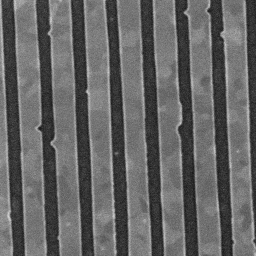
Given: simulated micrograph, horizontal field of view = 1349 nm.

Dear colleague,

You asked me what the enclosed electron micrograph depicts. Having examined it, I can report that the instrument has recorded parallel lines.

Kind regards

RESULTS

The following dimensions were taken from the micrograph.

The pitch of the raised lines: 183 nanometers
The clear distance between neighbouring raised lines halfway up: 69.1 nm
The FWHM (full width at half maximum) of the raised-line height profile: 112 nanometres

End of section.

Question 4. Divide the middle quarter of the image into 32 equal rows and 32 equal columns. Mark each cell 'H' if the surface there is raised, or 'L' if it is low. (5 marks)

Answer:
HHLLLLHHHHHLLLHHHHHHLLLHHHHHLLLL
HHLLLLHHHHHLLLHHHHHHLLLHHHHHLLLL
HHLLLLHHHHHLLLHHHHHHLLLHHHHHLLLL
HHLLLLHHHHHLLLHHHHHHLLLHHHHHLLLL
HHLLLLHHHHHLLLLHHHHHLLLHHHHHLLLL
HHLLLLHHHHHLLLLHHHHHLLLHHHHHHLLL
HHHLLLHHHHHLLLLHHHHHLLLHHHHHHLLL
HHHLLLHHHHHLLLLHHHHHLLLHHHHHHLLL
HHHLLLHHHHHLLLLHHHHHLLLHHHHHHLLL
HHHLLLHHHHHLLLLHHHHHLLLLHHHHHLLL
HHHLLLHHHHHLLLLHHHHHLLLLHHHHHLLL
HHHLLLHHHHHLLLLHHHHHLLLLHHHHHLLL
HHHLLLHHHHHLLLLHHHHHLLLLHHHHHLLL
HHHLLLHHHHHLLLLHHHHHLLLLHHHHHLLL
HHHLLLHHHHHLLLLHHHHHLLLLHHHHHLLL
HHHLLLHHHHHHLLLHHHHHLLLLHHHHHLLL
HHHLLLHHHHHHLLLHHHHHLLLLHHHHLLLL
HHHLLLHHHHHHLLLHHHHHLLLLHHHHHLLL
HHHLLLLHHHHHLLLHHHHHLLLLHHHHHLLL
HHHLLLLHHHHHLLLHHHHHLLLLHHHHHLLL
HHHLLLLHHHHHLLLHHHHHLLLLHHHHHLLL
HHHLLLLHHHHHLLLLHHHHLLLLHHHHHLLL
HHHLLLLHHHHHLLLLHHHHLLLLHHHHHLLL
HHHLLLLHHHHHLLLLHHHHHLLLHHHHHLLL
HHHLLLLHHHHHLLLLHHHHHLLLHHHHHLLL
HHHLLLLHHHHHLLLLHHHHHLLLHHHHHLLL
HHHLLLLHHHHHLLLLHHHHHLLLHHHHHLLL
HHHLLLLHHHHHLLLLHHHHHLLLHHHHHLLL
HHHLLLLHHHHHLLLLHHHHHLLLHHHHHLLL
HHHHLLLHHHHHLLLLHHHHHLLLHHHHHLLL
HHHHLLLHHHHHLLLLHHHHHLLLHHHHHLLL
HHHHLLLHHHHHLLLLHHHHHLLLHHHHHLLL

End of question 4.